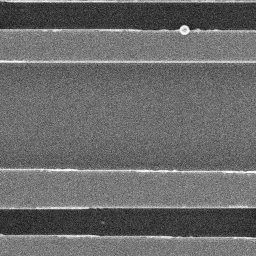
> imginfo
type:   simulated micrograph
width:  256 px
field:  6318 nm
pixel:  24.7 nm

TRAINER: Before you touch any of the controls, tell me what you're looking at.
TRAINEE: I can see lines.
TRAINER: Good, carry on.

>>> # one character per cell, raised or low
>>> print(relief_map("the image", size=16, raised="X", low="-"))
----------------
----------------
XXXXXXXXXXXXXXXX
XXXXXXXXXXXXXXXX
----------------
----------------
----------------
----------------
----------------
----------------
----------------
XXXXXXXXXXXXXXXX
XXXXXXXXXXXXXXXX
----------------
----------------
XXXXXXXXXXXXXXXX